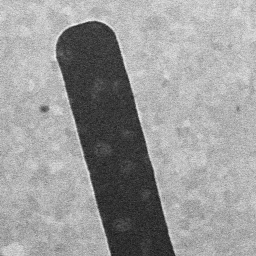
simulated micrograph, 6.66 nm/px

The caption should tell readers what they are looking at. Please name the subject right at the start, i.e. one or a few lines or trenches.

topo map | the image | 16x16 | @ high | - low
@@@@@@@@@@@@@@@@
@@@@@--@@@@@@@@@
@@@@---@@@@@@@@@
@@@-----@@@@@@@@
@@@@----@@@@@@@@
@@@@----@@@@@@@@
@@@@----@@@@@@@@
@@@@@----@@@@@@@
@@@@@----@@@@@@@
@@@@@----@@@@@@@
@@@@@-----@@@@@@
@@@@@@----@@@@@@
@@@@@@----@@@@@@
@@@@@@----@@@@@@
@@@@@@@----@@@@@
@@@@@@@----@@@@@